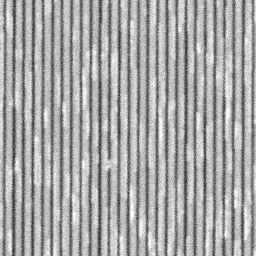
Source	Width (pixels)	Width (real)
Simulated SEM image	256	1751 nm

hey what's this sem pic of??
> parallel lines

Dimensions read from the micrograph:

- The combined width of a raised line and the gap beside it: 65.3 nm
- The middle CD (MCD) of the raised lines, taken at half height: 6.26 px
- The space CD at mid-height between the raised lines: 0.024 µm